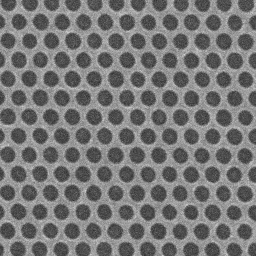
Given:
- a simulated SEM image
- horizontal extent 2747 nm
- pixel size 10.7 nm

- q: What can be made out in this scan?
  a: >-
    a regular array of holes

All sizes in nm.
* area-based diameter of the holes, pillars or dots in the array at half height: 182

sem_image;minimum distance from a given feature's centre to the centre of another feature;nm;230